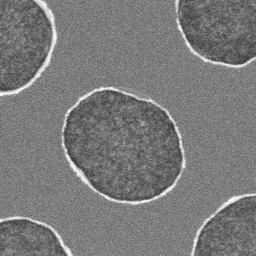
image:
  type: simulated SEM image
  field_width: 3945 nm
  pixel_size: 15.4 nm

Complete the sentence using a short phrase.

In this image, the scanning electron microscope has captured holes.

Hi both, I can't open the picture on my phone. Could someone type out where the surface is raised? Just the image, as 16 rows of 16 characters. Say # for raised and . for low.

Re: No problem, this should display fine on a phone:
...########.....
...########.....
...#########....
...##########...
..##############
.###############
#####.....######
####.......#####
####.......#####
####.......#####
#####......#####
######.....#####
#######..######.
#############...
...##########...
....########....